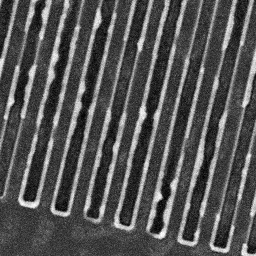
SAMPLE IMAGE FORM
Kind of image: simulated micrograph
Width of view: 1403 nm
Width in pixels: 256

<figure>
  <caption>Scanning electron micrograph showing parallel lines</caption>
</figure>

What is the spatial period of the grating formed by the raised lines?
179 nm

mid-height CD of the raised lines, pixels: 20.1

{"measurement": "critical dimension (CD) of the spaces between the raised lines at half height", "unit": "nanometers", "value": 68.7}